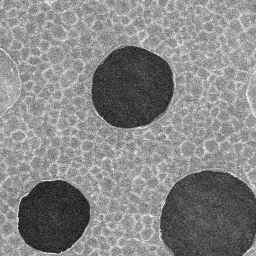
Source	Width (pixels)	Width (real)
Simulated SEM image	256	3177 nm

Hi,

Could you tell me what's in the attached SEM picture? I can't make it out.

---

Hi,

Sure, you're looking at holes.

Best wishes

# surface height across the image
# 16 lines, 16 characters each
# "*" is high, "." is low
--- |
****************
****************
****************
*******...******
******.....*****
******.....*****
******.....*****
*******...******
****************
****************
****************
**..*******....*
*....*****......
*.....****......
*....*****......
**..******......